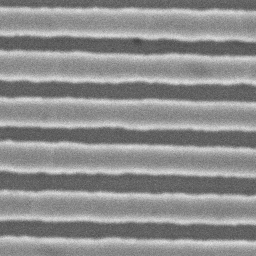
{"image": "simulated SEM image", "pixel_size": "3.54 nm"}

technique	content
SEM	lines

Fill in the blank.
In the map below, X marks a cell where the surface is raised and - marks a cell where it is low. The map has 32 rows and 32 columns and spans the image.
--------------------------------
XXXXXXXXXXXXXXXXXXXXXXXXXXXXXXXX
XXXXXXXXXXXXXXXXXXXXXXXXXXXXXXXX
XXXXXXXXXXXXXXXXXXXXXXXXXXXXXXXX
-----------XXXXXXXXXXXXXXXXXXXXX
--------------------------------
X-X-----------------------------
XXXXXXXXXXXXXXXXXXXXXXXXXXXXXXXX
XXXXXXXXXXXXXXXXXXXXXXXXXXXXXXXX
XXXXXXXXXXXXXXXXXXXXXXXXXXXXXXXX
--------------------------------
--------------------------------
XXXXXXXXXXX---------------------
XXXXXXXXXXXXXXXXXXXXXXXXXXXXXXXX
XXXXXXXXXXXXXXXXXXXXXXXXXXXXXXXX
XXXXXXXXXXXXXXXXXXXXXXXXXXXXXXXX
--------------------------------
--------------------------------
XXXXXXXXXXXXXXXXXXXXXXXXX-------
XXXXXXXXXXXXXXXXXXXXXXXXXXXXXXXX
XXXXXXXXXXXXXXXXXXXXXXXXXXXXXXXX
------XXX--X-XXX-XXXXXXXXXXXXXXX
--------------------------------
--------------------------------
XXXXXXXXXXXXXXXXXXXXXXXX-XX-----
XXXXXXXXXXXXXXXXXXXXXXXXXXXXXXXX
XXXXXXXXXXXXXXXXXXXXXXXXXXXXXXXX
-------XX--XXXXXXXXXXXXXXXXXXXXX
--------------------------------
--------------------------------
XXXXXXXXXXXXXXXXXXXXXXXXXXXXXXXX
XXXXXXXXXXXXXXXXXXXXXXXXXXXXXXXX